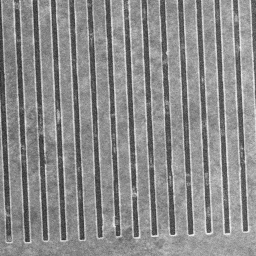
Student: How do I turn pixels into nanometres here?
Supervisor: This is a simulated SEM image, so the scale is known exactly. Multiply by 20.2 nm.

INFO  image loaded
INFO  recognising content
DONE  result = parallel lines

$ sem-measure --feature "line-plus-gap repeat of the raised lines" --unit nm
368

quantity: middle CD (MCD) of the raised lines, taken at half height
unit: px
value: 12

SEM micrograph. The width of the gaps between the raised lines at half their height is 129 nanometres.